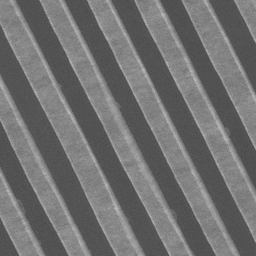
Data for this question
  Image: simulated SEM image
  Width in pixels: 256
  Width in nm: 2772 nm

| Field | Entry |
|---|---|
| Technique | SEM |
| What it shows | lines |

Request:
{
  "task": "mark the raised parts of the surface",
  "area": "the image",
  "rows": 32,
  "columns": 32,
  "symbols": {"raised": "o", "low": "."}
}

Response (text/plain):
oo...ooo...ooo...ooo...ooo...ooo
ooo...ooo...ooo..oooo..oooo...oo
ooo...ooo...ooo...ooo...ooo....o
oooo...ooo...ooo..oooo..oooo...o
.ooo...ooo...ooo...ooo...ooo....
.oooo...ooo...ooo...ooo..oooo...
..ooo...ooo...ooo...ooo...ooo...
..oooo...ooo...ooo...ooo..oooo..
...ooo...ooo...ooo...ooo...ooo..
...oooo...ooo...ooo...ooo..oooo.
o...ooo...ooo...ooo...ooo...ooo.
o...oooo...ooo...ooo...ooo..oooo
oo...ooo...ooo...ooo...ooo...ooo
oo...oooo...ooo...ooo...ooo..ooo
ooo...ooo...ooo...ooo...ooo...oo
ooo...oooo...ooo...ooo...ooo..oo
.ooo...ooo...ooo...ooo...ooo...o
.ooo...oooo...ooo...ooo...ooo..o
..ooo...ooo...ooo...ooo...ooo...
..ooo...oooo...ooo...ooo...ooo..
...ooo...ooo...ooo...ooo...ooo..
...ooo...oooo...ooo...ooo...ooo.
o...ooo...ooo...ooo...ooo...ooo.
o...ooo...oooo...ooo...ooo..oooo
oo...ooo...ooo...ooo...ooo...ooo
oo...ooo...oooo...ooo...ooo...oo
ooo...ooo...ooo...ooo...ooo...oo
ooo...ooo...oooo...ooo...ooo...o
.ooo...ooo...ooo...ooo...ooo...o
.ooo...ooo...oooo...ooo...ooo...
..ooo...ooo...ooo...ooo...ooo...
..ooo...ooo...oooo...ooo...ooo..